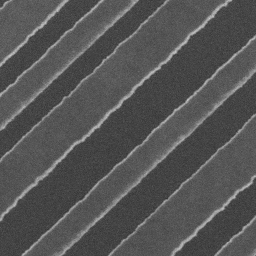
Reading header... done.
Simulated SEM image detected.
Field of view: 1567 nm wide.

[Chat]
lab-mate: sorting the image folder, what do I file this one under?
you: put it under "lines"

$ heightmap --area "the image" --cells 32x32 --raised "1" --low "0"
01111111000011111000111111110000
11111110000111110001111111100000
11111100001111100011111111000000
11111000011110000111111110000000
11110000111100001111111100000000
11100001111000011111111000000001
11000011110000111111110000000011
10000111100001111111100000000111
00001111000011111111000000011111
00111110000111111110000000011110
00111100001111111100000001111100
11111000011111111000000001111000
11110000111111100000000111110000
11100001111111100000001111100000
11000011111110000000011111000000
10000111111110000000111110000001
00001111111000000001111100000011
00111111110000000011111000000111
00111111100000000111110000001111
11111111000000001111100000011111
11111110000000011110000000111111
11111100000000111100000001111111
11111000000001111000000111111111
11110000000011110000001111111110
11100000000111100000011111111000
11000000001111000000111111110000
10000000111110000001111111100000
00000001111100000011111111000001
00000011111000000111111110000011
00000111110000001111111100000111
00001111100000011111111000001111
00011111000000111111110000011111